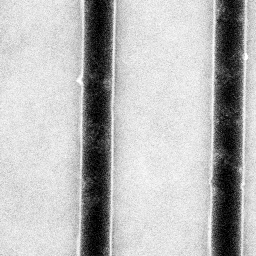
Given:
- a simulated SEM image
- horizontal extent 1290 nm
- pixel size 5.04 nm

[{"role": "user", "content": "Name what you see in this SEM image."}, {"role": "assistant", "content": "one or a few lines or trenches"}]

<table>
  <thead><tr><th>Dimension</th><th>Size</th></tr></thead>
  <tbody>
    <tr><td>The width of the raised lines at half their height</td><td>162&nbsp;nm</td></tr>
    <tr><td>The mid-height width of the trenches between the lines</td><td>496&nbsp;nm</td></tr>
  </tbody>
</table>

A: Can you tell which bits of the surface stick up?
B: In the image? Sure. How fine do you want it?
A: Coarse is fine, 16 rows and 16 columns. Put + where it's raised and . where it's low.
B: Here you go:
.....++......++.
.....++......++.
.....++......++.
.....++......++.
.....++......++.
.....++......++.
.....++......++.
.....++......++.
.....++......++.
.....++......++.
.....++......++.
.....++......++.
.....++......++.
.....++......++.
.....++......++.
.....++......++.